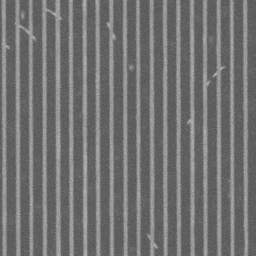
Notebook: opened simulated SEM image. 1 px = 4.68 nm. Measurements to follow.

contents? parallel lines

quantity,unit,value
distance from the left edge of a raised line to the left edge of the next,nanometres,62.8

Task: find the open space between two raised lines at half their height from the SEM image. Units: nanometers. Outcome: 48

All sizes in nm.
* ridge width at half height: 15.8